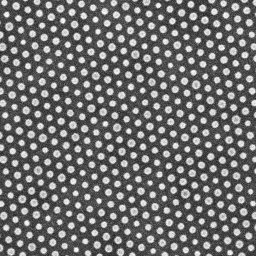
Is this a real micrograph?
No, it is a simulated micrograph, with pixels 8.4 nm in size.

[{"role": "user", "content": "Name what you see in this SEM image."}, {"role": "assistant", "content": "a regular array of raised bodies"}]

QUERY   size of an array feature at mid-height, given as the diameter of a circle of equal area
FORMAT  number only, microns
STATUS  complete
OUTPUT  0.051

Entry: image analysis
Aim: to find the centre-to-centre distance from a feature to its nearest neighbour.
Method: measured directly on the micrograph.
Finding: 101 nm